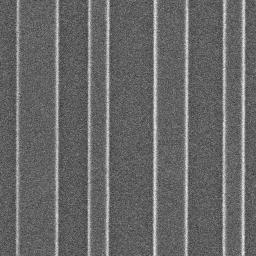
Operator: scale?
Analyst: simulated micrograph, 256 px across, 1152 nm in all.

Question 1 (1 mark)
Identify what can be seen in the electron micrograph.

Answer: one or a few lines or trenches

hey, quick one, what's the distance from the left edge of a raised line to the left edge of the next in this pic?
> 0.294 um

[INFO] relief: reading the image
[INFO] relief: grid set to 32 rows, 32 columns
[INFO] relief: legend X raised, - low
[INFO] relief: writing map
--XXXXX----XX------XXXX-----XX--
--XXXXX----XX------XXXX-----XX--
--XXXXX----XXX-----XXXX-----XX--
--XXXXX----XXX-----XXXX-----XX--
--XXXXX----XX------XXXX-----XX--
--XXXXX----XX------XXXX-----XX--
--XXXXX----XX------XXXX-----XX--
--XXXXX----XX------XXXX-----XX--
--XXXXX----XX------XXXX-----XX--
--XXXXX----XX------XXXX-----XX--
--XXXXX----XX------XXXX-----XX--
--XXXXX----XX------XXXX-----XX--
--XXXXX----XXX-----XXXX-----XX--
--XXXXX----XXX-----XXXX-----XX--
--XXXXX----XX------XXXX-----XX--
--XXXXX----XX------XXXX-----XX--
--XXXXX----XX------XXXX-----XX--
--XXXXX----XXX-----XXXX-----XX--
--XXXXX----XX------XXXX-----XX--
--XXXXX----XX------XXXX-----XX--
--XXXXX----XX------XXXX-----XX--
--XXXXX----XX------XXXX-----XX--
--XXXXX----XXX-----XXXX-----XX--
--XXXXX----XXX-----XXXX-----XX--
--XXXXX----XXX-----XXXX-----XX--
--XXXXX----XXX-----XXXX-----XX--
--XXXXX----XXX-----XXXX-----XX--
--XXXXX----XXX-----XXXX-----XX--
--XXXXX----XX------XXXX-----XX--
--XXXXX----XX------XXXX-----XX--
--XXXXX----XX------XXXX-----XX--
--XXXXX----XX------XXXX-----XX--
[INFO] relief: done